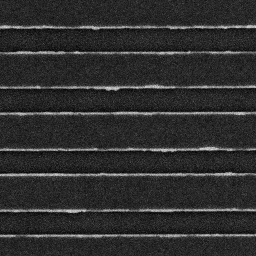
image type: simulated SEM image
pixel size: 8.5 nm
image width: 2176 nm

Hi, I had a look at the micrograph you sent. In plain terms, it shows one or a few lines or trenches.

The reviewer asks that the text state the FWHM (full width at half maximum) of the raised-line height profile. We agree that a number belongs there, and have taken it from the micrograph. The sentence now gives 0.321 um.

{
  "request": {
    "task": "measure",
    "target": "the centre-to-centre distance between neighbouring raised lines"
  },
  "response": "520 nm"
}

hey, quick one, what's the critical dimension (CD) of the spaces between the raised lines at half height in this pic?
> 201 nanometers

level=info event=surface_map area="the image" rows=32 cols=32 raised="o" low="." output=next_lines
oooooooooooooooooooooooooooooooo
oooooooooooooooooooooooooooooooo
oooooooooooooooooooooooooooooooo
o.ooooooo..oo........ooo........
................................
................................
..oooooo.o.............o....o...
oooooooooooooooooooooooooooooooo
oooooooooooooooooooooooooooooooo
oooooooooooooooooooooooooooooooo
oooooooooooooooooooooooooooooooo
................................
................................
................................
oooooooooooooooooooooooooooooooo
oooooooooooooooooooooooooooooooo
oooooooooooooooooooooooooooooooo
oooooooooooooooooooooooooooooooo
oooooooooooooooooooooooooooooooo
................................
................................
................................
oooooooooooooooooooooooooooooooo
oooooooooooooooooooooooooooooooo
oooooooooooooooooooooooooooooooo
oooooooooooooooooooooooooooooooo
........oo......................
................................
................................
oooooooooooooooooooooooooooooooo
oooooooooooooooooooooooooooooooo
oooooooooooooooooooooooooooooooo